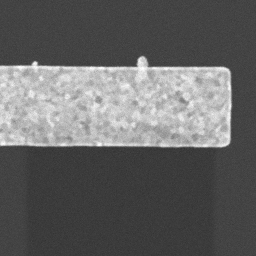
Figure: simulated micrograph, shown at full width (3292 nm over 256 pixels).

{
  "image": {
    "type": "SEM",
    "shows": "wiring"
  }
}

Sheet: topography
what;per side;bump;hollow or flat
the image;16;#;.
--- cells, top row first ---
................
................
................
................
##############..
##############..
##############..
##############..
##############..
................
................
................
................
................
................
................